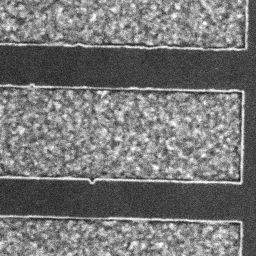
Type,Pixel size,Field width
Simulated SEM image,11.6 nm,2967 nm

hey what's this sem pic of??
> one or a few lines or trenches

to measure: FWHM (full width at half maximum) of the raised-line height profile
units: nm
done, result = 472